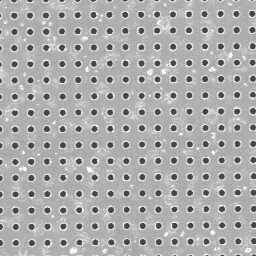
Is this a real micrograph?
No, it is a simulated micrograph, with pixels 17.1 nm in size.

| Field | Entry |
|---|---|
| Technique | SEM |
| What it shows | a regular array of holes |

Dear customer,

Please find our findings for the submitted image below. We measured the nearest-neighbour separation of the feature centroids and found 270 nm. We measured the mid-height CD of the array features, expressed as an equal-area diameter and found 106 nm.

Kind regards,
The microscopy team